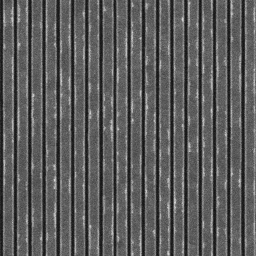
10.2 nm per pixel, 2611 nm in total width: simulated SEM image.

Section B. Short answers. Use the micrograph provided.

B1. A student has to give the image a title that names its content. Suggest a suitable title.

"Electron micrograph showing parallel lines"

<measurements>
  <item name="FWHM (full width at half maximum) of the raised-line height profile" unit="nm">103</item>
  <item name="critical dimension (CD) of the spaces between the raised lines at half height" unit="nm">43.4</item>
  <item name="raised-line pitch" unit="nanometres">145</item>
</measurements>